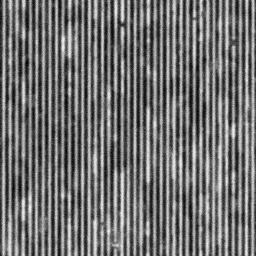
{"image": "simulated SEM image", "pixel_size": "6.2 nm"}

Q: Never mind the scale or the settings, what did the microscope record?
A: parallel lines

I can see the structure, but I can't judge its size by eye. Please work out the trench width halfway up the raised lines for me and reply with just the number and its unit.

0.0294 microns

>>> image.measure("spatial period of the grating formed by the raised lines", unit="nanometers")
40.7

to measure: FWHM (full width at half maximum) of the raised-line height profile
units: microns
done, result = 0.0116